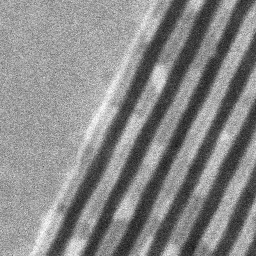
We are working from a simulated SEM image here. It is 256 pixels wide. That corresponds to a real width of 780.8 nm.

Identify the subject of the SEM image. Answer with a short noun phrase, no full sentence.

parallel lines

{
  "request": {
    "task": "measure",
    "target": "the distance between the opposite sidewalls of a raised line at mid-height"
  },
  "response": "47.3 nanometers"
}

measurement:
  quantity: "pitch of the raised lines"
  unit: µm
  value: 0.0908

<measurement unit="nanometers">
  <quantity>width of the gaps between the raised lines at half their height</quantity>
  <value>44.9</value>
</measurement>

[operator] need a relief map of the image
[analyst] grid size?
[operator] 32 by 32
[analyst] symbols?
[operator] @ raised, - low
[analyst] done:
-------------------@@--@@--@@---
------------------@@@--@@--@@--@
------------------@@--@@--@@@--@
-----------------@@@--@@--@@--@@
-----------------@@--@@@--@@--@@
-----------------@@--@@--@@--@@-
----------------@@--@@@--@@--@@-
----------------@@--@@--@@--@@--
---------------@@--@@---@@--@@--
---------------@@--@@--@@--@@--@
--------------@@--@@@--@@--@@--@
--------------@@--@@--@@--@@--@@
-------------@@@-@@@--@@--@@--@@
-------------@@--@@--@@--@@--@@-
------------@@--@@@--@@--@@--@@-
------------@@--@@--@@--@@--@@--
-----------@@---@---@@-@@@--@@--
-----------@@--@@--@@--@@--@@--@
----------@@--@@---@@--@@--@@--@
----------@@--@@--@@--@@--@@--@@
----------@---@@--@@--@@--@@--@@
---------@@--@@--@@--@@--@@--@@-
--------@@--@@@--@@--@@--@@--@@-
--------@@--@@--@@--@@@-@@--@@--
-------@@--@@---@@--@@--@@--@@--
-------@@--@@--@@--@@--@@--@@---
------@@--@@@-@@@--@@--@@--@@--@
------@@--@@--@@--@@--@@---@@--@
-----@@--@@@-@@@--@@--@@--@@--@@
-----@@--@@--@@--@@--@@@-@@@--@@
-----@--@@@--@@--@@--@@--@@--@@-
----@@--@@--@@--@@--@@@-@@@--@@-